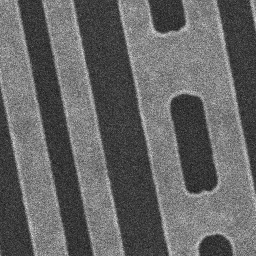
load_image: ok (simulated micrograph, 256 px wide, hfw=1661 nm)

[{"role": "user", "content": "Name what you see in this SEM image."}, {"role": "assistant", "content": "one or a few lines or trenches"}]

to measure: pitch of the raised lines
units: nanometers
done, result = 417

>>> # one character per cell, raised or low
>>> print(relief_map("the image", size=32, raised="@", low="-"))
@@----@@@------@@@-----@@@@-----
@@----@@@------@@@@----@@@@-----
@@----@@@------@@@@----@@@@-----
@@@---@@@@------@@@----@@@@@----
@@@---@@@@------@@@@@@@@@@@@----
@@@----@@@------@@@@@@@@@@@@----
@@@----@@@------@@@@@@@@@@@@----
@@@@---@@@------@@@@@@@@@@@@----
@@@@---@@@@------@@@@@@@@@@@@---
@@@@---@@@@------@@@@@@@@@@@@---
@@@@----@@@------@@@@@@@@@@@@---
@@@@----@@@------@@@@@@@@@@@@---
-@@@@---@@@@-----@@@@----@@@@---
-@@@@---@@@@------@@@-----@@@@--
-@@@@---@@@@------@@@-----@@@@--
-@@@@----@@@------@@@-----@@@@--
-@@@@----@@@------@@@@----@@@@--
--@@@@---@@@------@@@@----@@@@--
--@@@@---@@@@------@@@-----@@@@-
--@@@@---@@@@------@@@-----@@@@-
--@@@@----@@@------@@@-----@@@@-
--@@@@----@@@------@@@@----@@@@-
---@@@@---@@@------@@@@----@@@@-
---@@@@---@@@@------@@@----@@@@@
---@@@@---@@@@------@@@@@@@@@@@@
---@@@@----@@@------@@@@@@@@@@@@
---@@@@----@@@------@@@@@@@@@@@@
----@@@@---@@@------@@@@@@@@@@@@
----@@@@---@@@@------@@@@@@@@@@@
----@@@@---@@@@------@@@@@--@@@@
----@@@@----@@@------@@@@----@@@
----@@@@----@@@------@@@@----@@@